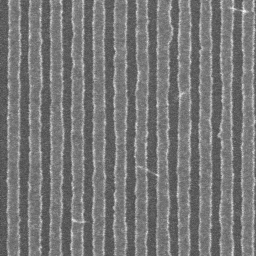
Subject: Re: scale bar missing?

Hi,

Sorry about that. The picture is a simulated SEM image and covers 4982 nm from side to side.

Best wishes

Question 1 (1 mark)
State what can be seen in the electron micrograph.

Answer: parallel lines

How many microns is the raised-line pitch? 0.414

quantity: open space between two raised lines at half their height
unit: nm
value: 190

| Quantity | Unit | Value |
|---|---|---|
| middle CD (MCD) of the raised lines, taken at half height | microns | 0.224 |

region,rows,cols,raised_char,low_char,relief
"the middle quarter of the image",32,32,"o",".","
..ooo..ooo...ooo..ooo..ooo...oo.
..ooo..ooo...ooo...oo..ooo...oo.
..ooo..ooo...oo....oo..ooo...oo.
..ooo..ooo...ooo..ooo..ooo...oo.
..ooo..ooo...ooo..ooo..ooo...ooo
..ooo..ooo...ooo..ooo..ooo...ooo
..ooo..ooo...ooo..ooo..ooo...ooo
..ooo..ooo...ooo..ooo..ooo...oo.
..ooo..ooo..oooo..ooo..ooo...oo.
..ooo..ooo..oooo..ooo..ooo...ooo
..ooo...oo...ooo..ooo..ooo...oo.
..ooo...oo...ooo..ooo..ooo...oo.
..ooo...oo...ooo..ooo...oo...oo.
..ooo..ooo..ooo...ooo..ooo...oo.
..ooo..ooo...oo...ooo..ooo...ooo
..ooo..ooo...ooo..ooo..ooo...ooo
..ooo..ooo...oo...ooo..ooo...ooo
..ooo..ooo...oo...ooo..ooo...ooo
..ooo..ooo...oo...ooo..ooo...oo.
..ooo..ooo...oo...ooo..ooo...oo.
..ooo..ooo...oo...ooo..ooo...oo.
..ooo..ooo...oo...oo...ooo..ooo.
..ooo..ooo...ooo..ooo..ooo..oooo
..ooo..ooo...oo...ooo..ooo..ooo.
..ooo..ooo...oo...ooo..ooo...oo.
..ooo...oo...oo...ooo..ooo..ooo.
..ooo...oo...oo...ooo..ooo..ooo.
..ooo..ooo...ooo..ooo..ooo..ooo.
..ooo..ooo...oo...ooo..ooo...oo.
..ooo..ooo...oo...ooo..ooo...oo.
..ooo..ooo...oo...ooo..ooo...oo.
..ooo..ooo...oo...ooo..ooo..ooo.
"